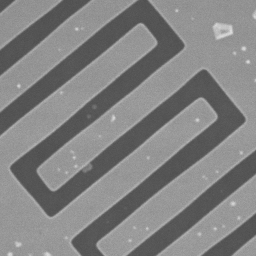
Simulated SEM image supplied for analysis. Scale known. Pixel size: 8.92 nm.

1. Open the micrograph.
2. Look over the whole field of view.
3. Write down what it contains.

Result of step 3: groups of lines, slits or small figures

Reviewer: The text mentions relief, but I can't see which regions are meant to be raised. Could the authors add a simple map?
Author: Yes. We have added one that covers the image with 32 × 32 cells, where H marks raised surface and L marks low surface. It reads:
LHHHHHHLLLLHHHHHLLLHHHHHHHHHHHHH
HHHHHHLLLHHHHHHLLLLLHHHHHHHHHHHH
HHHHHLLLHHHHHHLLLLLLLHHHHHHHHHHH
HHHLLLLHHHHHHLLLLHLLLHHHHHHHHHHH
HHLLLLHHHHHLLLLLHHHLLLHHHHHHHHHH
HLLLLHHHHHLLLLHHHHHHLLLHHHHHHHHH
LLLLHHHHHLLLLHHHHHHLLLLHHHHHHHHH
LLHHHHHHLLLLHHHHHLLLLHHHHHHHHHHH
LHHHHHHLLLLHHHHHLLLLHHHHHHHHHHHH
HHHHHLLLLHHHHHHLLLLHHHHHLLHHHHHH
HHHHLLLLHHHHHHLLLLHHHHHLLLLHHHHH
HHHLLLLHHHHHHLLLHHHHHHLLLLLLHHHH
HHLLLLHHHHHLLLLHHHHHHLLLLHLLLHHH
HLLLHHHHHHLLLLHHHHHLLLLHHHLLLLHH
LLLHHHHHHLLLLHHHHHLLLLHHHHHLLLHH
LLHHHHHHLLLHHHHHHLLLLHHHHHLLLLHH
LHHHHHHLLLHHHHHHLLLHHHHHHLLLLHHH
HHHHHLLLLHHHHHHLLLHHHHHHLLLLHHHH
HHHHLLLLHHHHHLLLLHHHHHHLLLLHHHHH
HHHLLLHHHHHHLLLLHHHHHHLLLLHHHHHL
HHLLLHHHHHHLLLLHHHHHLLLLHHHHHHLL
HLLLLHHHHHLLLLHHHHHLLLLHHHHHHLLL
HHLLLHHHHLLLHHHHHHLLLLHHHHHLLLLH
HHHLLLHLLLLHHHHHHLLLHHHHHHLLLLHH
HHHHLLLLLLHHHHHHLLLHHHHHHLLLLHHH
HHHHHLLLLHHHHHLLLLHHHHHHLLLHHHHH
HHHHHHLHHHHHHLLLLHHHHHHLLLHHHHHH
HHHHHHHHHHHHLLLLHHHHHLLLLHHHHHHL
HHHHHHHHHHHLLLHHHHHHLLLLHHHHHHLL
HHHHHHHHHLLLLHHHHHHLLLLHHHHHLLLL
HHHHHHHHHLLLHHHHHHLLLHHHHHHLLLLH
HHHHHHHHHHLLLHHHLLLLHHHHHHLLLHHH